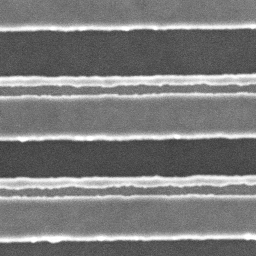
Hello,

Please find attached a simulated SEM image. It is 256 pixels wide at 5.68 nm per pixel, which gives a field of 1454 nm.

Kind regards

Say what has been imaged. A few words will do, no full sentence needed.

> lines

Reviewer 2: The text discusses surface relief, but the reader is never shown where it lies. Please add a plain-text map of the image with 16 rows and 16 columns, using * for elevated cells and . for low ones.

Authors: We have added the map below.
****************
****************
................
................
................
****************
****************
****************
****************
................
................
****************
****************
****************
****************
................